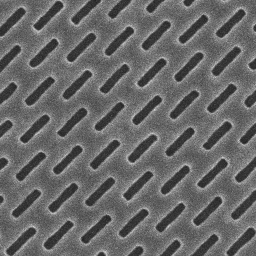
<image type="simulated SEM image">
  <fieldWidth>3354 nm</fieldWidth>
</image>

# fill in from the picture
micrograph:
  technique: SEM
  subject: a regular array of holes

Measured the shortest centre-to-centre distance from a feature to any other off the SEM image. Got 490 nanometres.